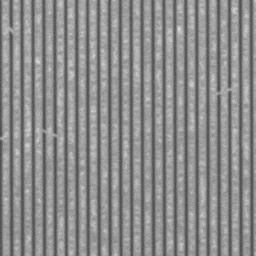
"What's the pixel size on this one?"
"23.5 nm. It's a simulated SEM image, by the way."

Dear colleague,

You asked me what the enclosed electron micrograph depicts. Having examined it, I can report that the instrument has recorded parallel lines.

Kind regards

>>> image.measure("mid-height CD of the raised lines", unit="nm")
179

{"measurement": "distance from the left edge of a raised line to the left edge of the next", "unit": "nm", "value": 256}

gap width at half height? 0.088 um